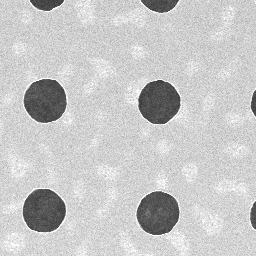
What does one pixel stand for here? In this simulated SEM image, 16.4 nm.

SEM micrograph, holes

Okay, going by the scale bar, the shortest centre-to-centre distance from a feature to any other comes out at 1.81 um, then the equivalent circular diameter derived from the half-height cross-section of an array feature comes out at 712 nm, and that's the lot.